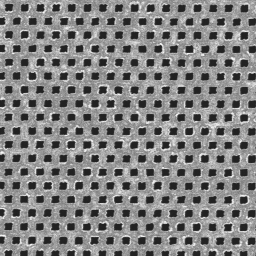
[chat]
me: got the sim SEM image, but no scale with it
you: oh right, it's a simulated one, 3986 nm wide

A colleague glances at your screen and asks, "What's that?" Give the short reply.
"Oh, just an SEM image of a regular array of holes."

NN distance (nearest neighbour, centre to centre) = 241 nanometers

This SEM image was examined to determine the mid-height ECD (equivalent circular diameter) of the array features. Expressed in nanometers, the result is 134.